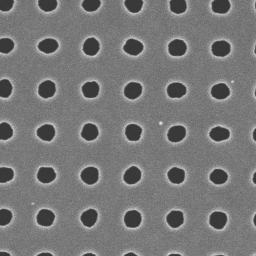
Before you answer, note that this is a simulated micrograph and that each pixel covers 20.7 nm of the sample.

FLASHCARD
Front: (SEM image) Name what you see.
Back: a regular array of holes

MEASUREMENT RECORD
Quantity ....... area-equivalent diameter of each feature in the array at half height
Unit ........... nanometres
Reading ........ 366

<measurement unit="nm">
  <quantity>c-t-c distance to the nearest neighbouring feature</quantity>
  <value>874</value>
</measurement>